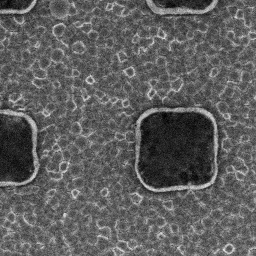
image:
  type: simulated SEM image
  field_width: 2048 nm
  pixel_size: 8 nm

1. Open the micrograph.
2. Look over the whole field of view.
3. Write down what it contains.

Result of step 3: raised bodies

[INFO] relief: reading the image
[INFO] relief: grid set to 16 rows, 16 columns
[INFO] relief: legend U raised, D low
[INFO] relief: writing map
UUDDDDDDDDUUUDDD
DDDDDDDDDDDDDDDD
DDDDDDDDDDDDDDDD
DDDDDDDDDDDDDDDD
DDDDDDDDDDDDDDDD
DDDDDDDDDDDDDDDD
DDDDDDDDDDDDDDDD
UUDDDDDDDUUUUDDD
UUDDDDDDDUUUUDDD
UUDDDDDDDUUUUDDD
UUDDDDDDDUUUUUDD
DDDDDDDDDUUUUDDD
DDDDDDDDDDDDDDDD
DDDDDDDDDDDDDDDD
DDDDDDDDDDDDDDDD
DDDDDDDDDDDDDDDD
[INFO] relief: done